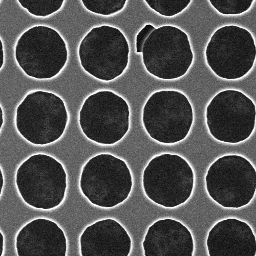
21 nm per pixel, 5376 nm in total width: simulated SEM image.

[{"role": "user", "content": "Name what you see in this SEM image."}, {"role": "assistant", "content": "a regular array of holes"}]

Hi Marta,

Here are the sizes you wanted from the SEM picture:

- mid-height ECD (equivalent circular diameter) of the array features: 1090 nm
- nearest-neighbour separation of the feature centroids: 1320 nanometres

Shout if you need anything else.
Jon